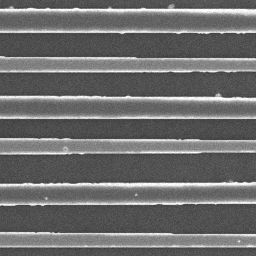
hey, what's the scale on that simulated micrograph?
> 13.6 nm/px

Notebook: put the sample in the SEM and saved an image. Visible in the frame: lines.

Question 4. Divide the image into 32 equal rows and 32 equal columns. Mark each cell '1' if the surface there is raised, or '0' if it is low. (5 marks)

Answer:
00000000000000000000000000000000
11111111111111111111111111111111
11111111111111111111111111111111
11111111111111111111111111111111
00000000000000000000000000000000
00000000000000000000000000000000
00000000000000000000000000000000
11111111111111111111111111111111
11111111111111111111111111111111
00000000000000000000000000000000
00000000000000000000000000000000
00000000000000000000000000000000
11111111111111111111111111111111
11111111111111111111111111111111
11111111111111111111111111111111
00000000000000000000000000000000
00000000000000000000000000000000
11111111111111111111110110000000
11111111111111111111111111111111
00000000000000000000000000000000
00000000000000000000000000000000
00000000000000000000000000000000
00000000000000000000000000000000
11111111111111111111111111111111
11111111111111111111111111111111
11111111111111111111111000000000
00000000000000000000000000000000
00000000000000000000000000000000
00000000000000000000000000000000
11111111111111111111111111111111
11111111111111111111111111111111
00000000000000000000000000000000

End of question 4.